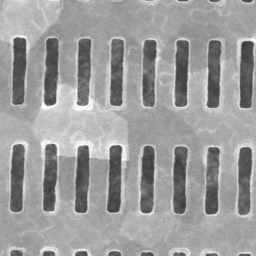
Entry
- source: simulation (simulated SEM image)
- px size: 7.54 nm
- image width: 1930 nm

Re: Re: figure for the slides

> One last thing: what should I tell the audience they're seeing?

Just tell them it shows a regular array of holes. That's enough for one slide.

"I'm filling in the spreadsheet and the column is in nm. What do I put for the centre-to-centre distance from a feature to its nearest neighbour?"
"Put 244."